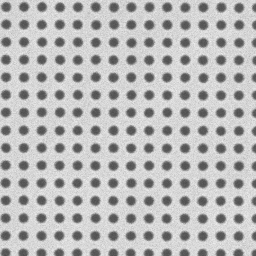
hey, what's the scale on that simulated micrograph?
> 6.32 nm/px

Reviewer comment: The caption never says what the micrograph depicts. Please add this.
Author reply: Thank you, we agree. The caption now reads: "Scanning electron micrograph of a regular array of holes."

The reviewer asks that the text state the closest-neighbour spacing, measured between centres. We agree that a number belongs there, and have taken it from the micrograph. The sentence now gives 0.11 micrometres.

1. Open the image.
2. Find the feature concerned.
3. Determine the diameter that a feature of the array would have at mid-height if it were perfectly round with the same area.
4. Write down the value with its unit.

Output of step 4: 0.0614 micrometres